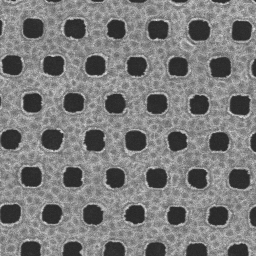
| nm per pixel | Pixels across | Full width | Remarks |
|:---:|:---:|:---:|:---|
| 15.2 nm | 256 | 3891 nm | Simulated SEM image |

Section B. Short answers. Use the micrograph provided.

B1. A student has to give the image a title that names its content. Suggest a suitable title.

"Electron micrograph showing a regular array of holes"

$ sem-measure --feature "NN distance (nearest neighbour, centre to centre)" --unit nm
629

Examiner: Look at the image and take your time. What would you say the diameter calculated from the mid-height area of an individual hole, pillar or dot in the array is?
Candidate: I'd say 322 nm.